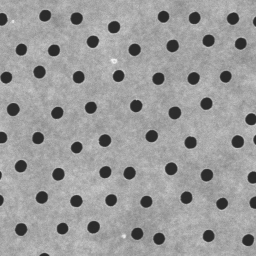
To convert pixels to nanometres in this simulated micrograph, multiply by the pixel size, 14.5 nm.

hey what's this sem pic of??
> a regular array of holes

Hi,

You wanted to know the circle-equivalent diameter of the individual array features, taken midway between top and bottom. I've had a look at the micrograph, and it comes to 180 nm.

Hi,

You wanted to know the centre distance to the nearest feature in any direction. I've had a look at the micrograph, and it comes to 446 nm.